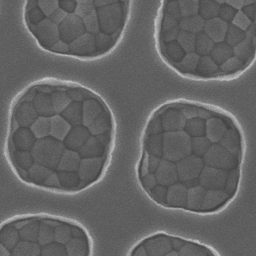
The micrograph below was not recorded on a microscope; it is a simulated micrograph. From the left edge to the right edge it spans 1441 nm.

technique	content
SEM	holes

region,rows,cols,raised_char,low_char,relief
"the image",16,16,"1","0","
1100000011000000
1100000011000000
1100000111000000
1111101111000000
1111111111100001
1100011111111111
1000000111001111
1000000110000001
1000000110000001
1000000110000001
1000000110000001
1100001110000001
1111111111000011
1111111111111111
0000011111111111
0000001100000111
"